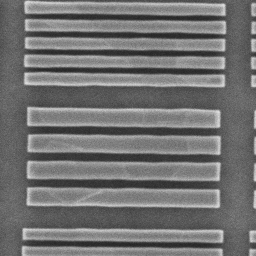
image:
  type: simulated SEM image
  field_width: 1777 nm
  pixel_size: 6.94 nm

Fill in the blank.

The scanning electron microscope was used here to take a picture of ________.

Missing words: groups of lines, slits or small figures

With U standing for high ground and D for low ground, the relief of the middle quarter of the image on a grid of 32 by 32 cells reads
DDUUUUUUUUUUUUUUUUUUUUUUUUUUUUUU
DDDDDDDDDDDDDDDDDDDDDDDDDDDDDDDD
UUUUUUUUUUUDDDDDDDDDDDDDDDDDDDDD
UUUUUUUUUUUUUUUUUUUUUUUUUUUUUUUU
UUUUUUUUUUUUUUUUUUUUUUUUUUUUUUUU
DDDDDDDDDDDDDDDDDDDDDDDDDDDDDDDD
DDDDDDDDDDDDDDDDDDDDDDDDDDDDDDDD
DDDDDDDDDDDDDDDDDDDDDDDDDDDDDDDD
DDDDDDDDDDDDDDDDDDDDDDDDDDDDDDDD
DDDDDDDDDDDDDDDDDDDDDDDDDDDDDDDD
DDDDDDDDDDDDDDDDDDDDDDDDDDDDDDDD
UUUUUUUUUUUUUUUUUUUUUUUUUUDDUUUU
UUUUUUUUUUUUUUUUUUUUUUUUUUUUUUUU
UUUUUUUUUUUUUUUUUUUUUUUUUUUUUUUU
UUUUUUUUUUUUUUUUUUUUUUUUUUUUUUUU
DDDDDDDDUUUUUUUUUUUUUUUUUUUUUUUU
DDDDDDDDDDDDDDDDDDDDDDDDDDDDDDDD
DDDDDDDDDDDDDDDDDDDDDDDDDDDDDDDD
UUUUUUUUUUUUUUUUUUUUUUUUUUUUUUUU
UUUUUUUUUUUUUUUUUUUUUUUUUUUUUUUU
UUUUUUUUUUUUUUUUUUUUUUUUUUUUUUUU
UUUUUUUUUUUUUUUUUUUUUUUUUUUUUUUU
DDDDDDDDDDDDDDDDDDDDDDDDDDDDDDDD
DDDDDDDDDDDDDDDDDDDDDDDDDDDDDDDD
DDDDDDDDDDDDDDDDDDDDDDDDDDDDDDDD
UUUUUUUUUUUUUUUUUUUUUUUUUUUUUUUU
UUUUUUUUUUUUUUUUUUUUUUUUUUUUUUUU
UUUUUUUUUUUUUUUUUUUUUUUUUUUUUUUU
UUUUUUUUUUUUUUUUUUUUUUUUUUUUUUUU
DDDDDDDDDDDDDDDDDDDDDDDDDDDDDDDD
DDDDDDDDDDDDDDDDDDDDDDDDDDDDDDDD
UUUUUUUUUUUUUUUUUUUUUUDDDDDDDDDD